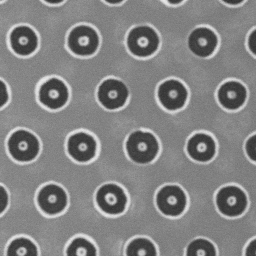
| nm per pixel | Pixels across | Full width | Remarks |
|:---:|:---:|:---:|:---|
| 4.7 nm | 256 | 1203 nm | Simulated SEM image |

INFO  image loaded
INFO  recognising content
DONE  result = a regular array of ring-shaped grooves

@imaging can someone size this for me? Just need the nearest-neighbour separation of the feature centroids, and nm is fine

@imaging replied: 279